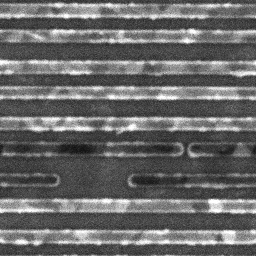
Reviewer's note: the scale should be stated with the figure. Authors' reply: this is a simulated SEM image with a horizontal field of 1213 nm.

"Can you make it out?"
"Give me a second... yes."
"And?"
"parallel lines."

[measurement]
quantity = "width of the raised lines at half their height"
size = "56.3 nm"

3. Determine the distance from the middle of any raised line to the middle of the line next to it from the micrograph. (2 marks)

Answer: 28.3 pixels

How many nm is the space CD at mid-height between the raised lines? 65.7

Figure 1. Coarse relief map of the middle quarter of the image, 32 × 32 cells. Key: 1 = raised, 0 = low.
11111111111111111111111111111111
11111111111111111111111111111111
00000000000000000000011110000000
00000000000000000000000000000000
00000000000000000000000000000000
00000000000000000000000000000000
11111111111111111111111111111111
11111111111111111111111111111111
10011010000111110111000111110000
00000000000000000000000000000000
00000000000000000000000000000000
00000000000000000000000000000000
00000000000000000000000000000000
01001000000110000100011110000000
11111111111111111111111111111111
11111111111111111111111111111111
00011111001101111100000000110000
00000000000000000000000000000000
00000000000000000000000000000000
00000000000000000000000000000000
11111111111111111111111111111001
11111111111111111111111111111101
11111111111111111111111111111001
00000000000000000000000000000000
00000000000000000000000000000000
00000000000000000000000000000000
00000000000000000000000000000000
00000000000000000000000110000000
00000000000000001111111111111111
00000000000000001111111111111111
00000000000000000100000000001011
00000000000000000000000000000000